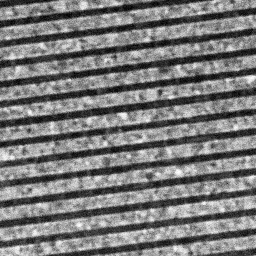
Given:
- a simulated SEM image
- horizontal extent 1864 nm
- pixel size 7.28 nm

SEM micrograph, parallel lines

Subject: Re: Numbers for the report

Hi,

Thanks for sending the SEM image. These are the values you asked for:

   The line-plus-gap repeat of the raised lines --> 145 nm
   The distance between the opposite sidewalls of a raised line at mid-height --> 0.0786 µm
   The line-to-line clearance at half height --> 64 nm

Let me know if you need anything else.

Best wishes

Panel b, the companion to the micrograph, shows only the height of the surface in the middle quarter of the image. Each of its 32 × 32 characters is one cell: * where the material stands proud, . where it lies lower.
***********..................***
***..................***********
..............******************
......********************......
******************..............
**********.....................*
***..................***********
.............*******************
......*******************.*.....
******************..............
**********....................**
**....................**********
...............*****************
.......********************.....
*******************.............
***********.................****
****..................**********
..............******************
.......*******************......
*******************.............
***********..................***
***...................**********
..............******************
......********************......
******************..............
***********..................***
***..................***********
.............*******************
......********************......
******************..............
**********..................****
**...................***********